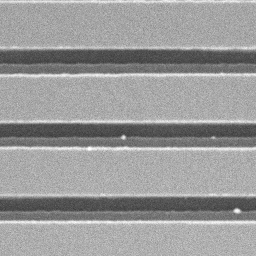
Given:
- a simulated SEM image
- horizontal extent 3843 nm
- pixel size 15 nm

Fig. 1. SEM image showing lines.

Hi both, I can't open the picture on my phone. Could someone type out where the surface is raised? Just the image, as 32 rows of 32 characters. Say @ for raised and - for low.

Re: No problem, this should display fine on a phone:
@@@@@@@@@@@@@@@@@@@@@@@@@@@@@@@@
@@@@@@@@@@@@@@@@@@@@@@@@@@@@@@@@
@@@@@@@@@@@@@@@@@@@@@@@@@@@@@@@@
@@@@@@@@@@@@@@@@@@@@@@@@@@@@@@@@
@@@@@@@@@@@@@@@@@@@@@@@@@@@@@@@@
@@@@@@@@@@@@@@@@@@@@@@@@@@@@@@@@
--------------------------------
--------------------------------
--------------------------------
@@@@@@@@@@@@@@@@@@@@@@@@@@@@@@@@
@@@@@@@@@@@@@@@@@@@@@@@@@@@@@@@@
@@@@@@@@@@@@@@@@@@@@@@@@@@@@@@@@
@@@@@@@@@@@@@@@@@@@@@@@@@@@@@@@@
@@@@@@@@@@@@@@@@@@@@@@@@@@@@@@@@
@@@@@@@@@@@@@@@@@@@@@@@@@@@@@@@@
--------------------------------
--------------------------------
--------------------------------
@@@@@@@@@@-@@@@@@----@---------@
@@@@@@@@@@@@@@@@@@@@@@@@@@@@@@@@
@@@@@@@@@@@@@@@@@@@@@@@@@@@@@@@@
@@@@@@@@@@@@@@@@@@@@@@@@@@@@@@@@
@@@@@@@@@@@@@@@@@@@@@@@@@@@@@@@@
@@@@@@@@@@@@@@@@@@@@@@@@@@@@@@@@
--@----------@------------------
--------------------------------
--------------------------------
--------------------------------
@@@@@@@@@@@@@@@@@@@@@@@@@@@@@@@@
@@@@@@@@@@@@@@@@@@@@@@@@@@@@@@@@
@@@@@@@@@@@@@@@@@@@@@@@@@@@@@@@@
@@@@@@@@@@@@@@@@@@@@@@@@@@@@@@@@